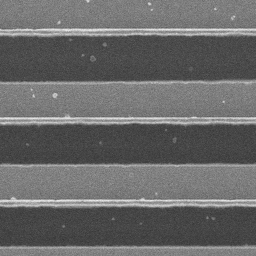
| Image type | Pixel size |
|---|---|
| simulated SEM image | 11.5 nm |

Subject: lines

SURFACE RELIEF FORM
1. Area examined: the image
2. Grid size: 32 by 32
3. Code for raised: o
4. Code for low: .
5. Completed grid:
oooooooooooooooooooooooooooooooo
oooooooooooooooooooooooooooooooo
oooooooooooooooooooooooooooooooo
oooooooooooooooooooooooooooooooo
................................
................................
................................
................................
................................
................................
oooooooooooooooooooooooooooooooo
oooooooooooooooooooooooooooooooo
oooooooooooooooooooooooooooooooo
oooooooooooooooooooooooooooooooo
oooooooooooooooooooooooooooooooo
................................
................................
................................
................................
................................
................................
oooooooooooooooooooooooooooooooo
oooooooooooooooooooooooooooooooo
oooooooooooooooooooooooooooooooo
oooooooooooooooooooooooooooooooo
oooooooooooooooooooooooooooooooo
................................
................................
................................
................................
................................
oooooooooooooooooooooooooooooooo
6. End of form